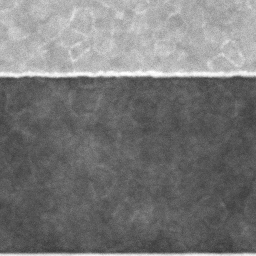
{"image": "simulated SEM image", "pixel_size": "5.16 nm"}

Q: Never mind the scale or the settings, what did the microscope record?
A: one or a few lines or trenches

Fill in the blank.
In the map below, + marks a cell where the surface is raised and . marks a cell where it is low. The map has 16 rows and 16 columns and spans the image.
++++++++++++++++
++++++++++++++++
++++++++++++++++
++++++++++++++++
++++++++++++++++
................
................
................
................
................
................
................
................
................
................
................